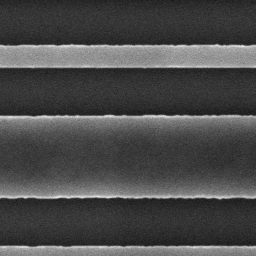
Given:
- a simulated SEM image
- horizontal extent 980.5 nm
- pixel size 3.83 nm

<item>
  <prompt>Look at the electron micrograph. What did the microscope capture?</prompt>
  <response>lines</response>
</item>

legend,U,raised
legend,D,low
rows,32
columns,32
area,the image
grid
DDDDDDDDDDDDDDDDDDDDDDDDDDDDDDDD
DDDDDDDDDDDDDDDDDDDDDDDDDDDDDDDD
DDDDDDDDDDDDDDDDDDDDDDDDDDDDDDDD
DDDDDDDDDDDDDDDDDDDDDDDDDDDDDDDD
DDDDDDDDDDDDDDDDDDDDDDDDDDDDDDDD
DDDDDDDDDDDDDDDDDDDDDDDDDDDDDDDD
UUUUUUUUUUUUUUUUUUUUUUUUUUUUUUUU
UUUUUUUUUUUUUUUUUUUUUUUUUUUUUUUU
DDDDDDDDDDDDDDDDDDDDDDDDDDDDDDDD
DDDDDDDDDDDDDDDDDDDDDDDDDDDDDDDD
DDDDDDDDDDDDDDDDDDDDDDDDDDDDDDDD
DDDDDDDDDDDDDDDDDDDDDDDDDDDDDDDD
DDDDDDDDDDDDDDDDDDDDDDDDDDDDDDDD
DDDDDDDDDDDDDDDDDDDDDDDDDDDDDDDD
DDDDDUDUUUDDDUUUDDUUUDUUDUDUUUDU
UUUUUUUUUUUUUUUUUUUUUUUUUUUUUUUU
UUUUUUUUUUUUUUUUUUUUUUUUUUUUUUUU
UUUUUUUUUUUUUUUUUUUUUUUUUUUUUUUU
UUUUUUUUUUUUUUUUUUUUUUUUUUUUUUUU
UUUUUUUUUUUUUUUUUUUUUUUUUUUUUUUU
UUUUUUUUUUUUUUUUUUUUUUUUUUUUUUUU
UUUUUUUUUUUUUUUUUUUUUUUUUUUUUUUU
UUUUUUUUUUUUUUUUUUUUUUUUUUUUUUUU
UUUUUUUUUUUUUUUUUUUUUUUUUUUUUUUU
UUUUUUUUUUUUUUUUUUUUUUUUUUUUUUUU
DDDDDDDDDDDDDDDDDDDDDDDDDDDDDDDD
DDDDDDDDDDDDDDDDDDDDDDDDDDDDDDDD
DDDDDDDDDDDDDDDDDDDDDDDDDDDDDDDD
DDDDDDDDDDDDDDDDDDDDDDDDDDDDDDDD
DDDDDDDDDDDDDDDDDDDDDDDDDDDDDDDD
DDDDDDDDDDDDDDDDDDDDDDDDDDDDDDDD
UUUUUUUUUUUUUUUUUUUUUUUUUUUUUUUU